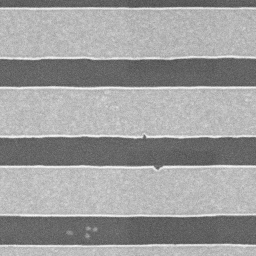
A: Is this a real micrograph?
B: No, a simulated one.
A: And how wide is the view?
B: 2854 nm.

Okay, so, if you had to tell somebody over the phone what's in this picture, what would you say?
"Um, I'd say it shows one or a few lines or trenches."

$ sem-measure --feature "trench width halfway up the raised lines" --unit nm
339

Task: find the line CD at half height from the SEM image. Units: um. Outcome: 0.545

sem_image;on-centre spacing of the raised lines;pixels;79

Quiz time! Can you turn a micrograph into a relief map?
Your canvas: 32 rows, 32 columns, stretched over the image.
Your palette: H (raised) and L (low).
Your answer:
LLLLLLLLLLLLLLLLLLLLLLLLLLLLLLLL
HHHHHHHHHHHHHHHHHHHHHHHHHHHHHHHH
HHHHHHHHHHHHHHHHHHHHHHHHHHHHHHHH
HHHHHHHHHHHHHHHHHHHHHHHHHHHHHHHH
HHHHHHHHHHHHHHHHHHHHHHHHHHHHHHHH
HHHHHHHHHHHHHHHHHHHHHHHHHHHHHHHH
HHHHHHHHHHHHHHHHHHHHHHHHHHHHHHHH
LLLLLLLLLLLLLLLLLLLLLLLLLLLLLLLL
LLLLLLLLLLLLLLLLLLLLLLLLLLLLLLLL
LLLLLLLLLLLLLLLLLLLLLLLLLLLLLLLL
LLLLLLLLLLLLLLLLLLLLLLLLLLLLLLLL
HHHHHHHHHHHHHHHHHHHHHHHHHHHHHHHH
HHHHHHHHHHHHHHHHHHHHHHHHHHHHHHHH
HHHHHHHHHHHHHHHHHHHHHHHHHHHHHHHH
HHHHHHHHHHHHHHHHHHHHHHHHHHHHHHHH
HHHHHHHHHHHHHHHHHHHHHHHHHHHHHHHH
HHHHHHHHHHHHHHHHHHHHHHHHHHHHHHHH
LLLLLLLLLLLLLLLLLLLLLLLLLLLLLLLL
LLLLLLLLLLLLLLLLLLLLLLLLLLLLLLLL
LLLLLLLLLLLLLLLLLLLLLLLLLLLLLLLL
LLLLLLLLLLLLLLLLLLLLLLLLLLLLLLLL
HHHHHHHHHHHHHHHHHHHHHHHHHHHHHHHH
HHHHHHHHHHHHHHHHHHHHHHHHHHHHHHHH
HHHHHHHHHHHHHHHHHHHHHHHHHHHHHHHH
HHHHHHHHHHHHHHHHHHHHHHHHHHHHHHHH
HHHHHHHHHHHHHHHHHHHHHHHHHHHHHHHH
HHHHHHHHHHHHHHHHHHHHHHHHHHHHHHHH
LLLLLLLLLLLLLLLLLLLLLLLLLLLLLLLL
LLLLLLLLLLLLLLLLLLLLLLLLLLLLLLLL
LLLLLLLLLLLLLLLLLLLLLLLLLLLLLLLL
LLLLLLLLLLLLLLLLLLLLLLLLLLLLLLLL
HHHHHHHHHHHHHHHHHHHHHHHHHHHHHHHH